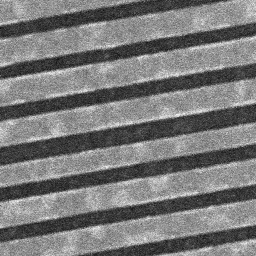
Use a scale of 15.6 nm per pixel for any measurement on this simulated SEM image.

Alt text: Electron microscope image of parallel lines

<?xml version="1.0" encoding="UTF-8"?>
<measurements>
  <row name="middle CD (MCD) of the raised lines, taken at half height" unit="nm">379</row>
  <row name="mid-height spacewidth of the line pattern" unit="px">16.1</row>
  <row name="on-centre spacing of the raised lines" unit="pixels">40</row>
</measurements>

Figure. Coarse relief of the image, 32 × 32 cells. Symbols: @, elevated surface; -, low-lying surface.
@@@@@@@@@@@@@@@-----------@@@@@@
@@@@@@@@@------------@@@@@@@@@@@
@@@------------@@@@@@@@@@@@@@@@@
---------@@@@@@@@@@@@@@@@@@-----
---@@@@@@@@@@@@@@@@@@@----------
@@@@@@@@@@@@@@@@-----------@@@@@
@@@@@@@@@@-----------@@@@@@@@@@@
@@@@-----------@@@@@@@@@@@@@@@@@
---------@@@@@@@@@@@@@@@@@@@----
----@@@@@@@@@@@@@@@@@@----------
@@@@@@@@@@@@@@@@------------@@@@
@@@@@@@@@@------------@@@@@@@@@@
@@@@------------@@@@@@@@@@@@@@@@
----------@@@@@@@@@@@@@@@@@@----
----@@@@@@@@@@@@@@@@@@----------
@@@@@@@@@@@@@@@@---------------@
@@@@@@@@@@---------------@@@@@@@
@@@@@---------------@@@@@@@@@@@@
--------------@@@@@@@@@@@@@@----
--------@@@@@@@@@@@@@@----------
--@@@@@@@@@@@@@@@------------@@@
@@@@@@@@@@@------------@@@@@@@@@
@@@@@------------@@@@@@@@@@@@@@@
-----------@@@@@@@@@@@@@@@@@----
-----@@@@@@@@@@@@@@@@@@---------
@@@@@@@@@@@@@@@@@------------@@@
@@@@@@@@@@@------------@@@@@@@@@
@@@@@------------@@@@@@@@@@@@@@@
-----------@@@@@@@@@@@@@@@@@@---
-----@@@@@@@@@@@@@@@@@@---------
@@@@@@@@@@@@@@@@@------------@@@
@@@@@@@@@@@@-----------@@@@@@@@@